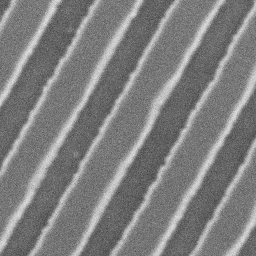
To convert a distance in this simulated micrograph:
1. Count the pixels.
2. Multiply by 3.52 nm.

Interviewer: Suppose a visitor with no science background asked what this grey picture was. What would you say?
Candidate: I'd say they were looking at lines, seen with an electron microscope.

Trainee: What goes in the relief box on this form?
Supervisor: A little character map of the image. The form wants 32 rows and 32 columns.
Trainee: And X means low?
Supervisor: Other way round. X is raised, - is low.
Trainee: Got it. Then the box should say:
-XXXXXX-----XXXXX-----XXXXXX----
-XXXXXX----XXXXXX----XXXXXX----X
XXXXXX-----XXXXX----XXXXXX-----X
XXXXX-----XXXXXX----XXXXXX----XX
XXXXX-----XXXXX----XXXXXX----XXX
XXXX-----XXXXX-----XXXXXX----XXX
XXXX----XXXXXX----XXXXXX-----XXX
XXX-----XXXXX-----XXXXX-----XXXX
XXX----XXXXXX----XXXXXX----XXXXX
XX-----XXXXX----XXXXXX-----XXXXX
XX----XXXXXX----XXXXXX----XXXXXX
X----XXXXXX----XXXXXX-----XXXXX-
-----XXXXXX----XXXXX-----XXXXXX-
----XXXXXX----XXXXXX----XXXXXX--
----XXXXXX----XXXXX-----XXXXX---
---XXXXXX----XXXXXX----XXXXXX---
---XXXXX-----XXXXX-----XXXXX----
--XXXXXX----XXXXXX----XXXXXX----
--XXXXX----XXXXXX-----XXXXX----X
-XXXXXX----XXXXXX----XXXXXX----X
XXXXXX----XXXXXX-----XXXXX----XX
XXXXX-----XXXXX-----XXXXXX----XX
XXXXX----XXXXXX-----XXXXX----XXX
XXXX-----XXXXX-----XXXXX-----XXX
XXXX----XXXXXX----XXXXXX----XXXX
XXX----XXXXXX-----XXXXX-----XXXX
XXX----XXXXXX----XXXXXX----XXXXX
XX----XXXXXX-----XXXXX----XXXXXX
X-----XXXXXX----XXXXXX----XXXXX-
X----XXXXXX----XXXXXX----XXXXXX-
-----XXXXXX----XXXXX-----XXXXX--
----XXXXXX----XXXXXX----XXXXX---